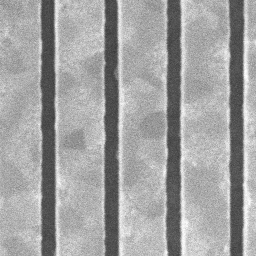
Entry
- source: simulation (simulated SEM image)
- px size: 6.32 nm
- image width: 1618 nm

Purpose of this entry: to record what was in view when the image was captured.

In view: lines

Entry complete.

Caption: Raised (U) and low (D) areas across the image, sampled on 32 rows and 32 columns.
UUUUUDDUUUUUUDDUUUUUUDDUUUUUUDDU
UUUUUDDUUUUUUDDUUUUUUDDUUUUUUDDU
UUUUUDDUUUUUUDDUUUUUUDDUUUUUUDDU
UUUUUDDUUUUUUDDUUUUUUDDUUUUUUDDU
UUUUUDDUUUUUUDDUUUUUUDDUUUUUUDDU
UUUUUDDUUUUUUDDUUUUUUDDUUUUUUDDU
UUUUUDDUUUUUUDDUUUUUUDDUUUUUUDDU
UUUUUDDUUUUUUDDUUUUUUDDUUUUUUDDU
UUUUUDDUUUUUUDDUUUUUUDDUUUUUUDDU
UUUUUDDUUUUUUDDUUUUUUDDUUUUUUDDU
UUUUUDDUUUUUUDDUUUUUUDDUUUUUUDDU
UUUUUDDUUUUUUDDUUUUUUDDUUUUUUDDU
UUUUUDDUUUUUUDDUUUUUUDDUUUUUUDDU
UUUUUDDUUUUUUDDUUUUUUDDUUUUUUDDU
UUUUUDDUUUUUUDDUUUUUUDDUUUUUUDDU
UUUUUDDUUUUUUDDUUUUUUDDUUUUUUDDU
UUUUUDDUUUUUUDDUUUUUUDDUUUUUUDDU
UUUUUDDUUUUUUDDUUUUUUDDUUUUUUDDU
UUUUUDDUUUUUUDDUUUUUUDDUUUUUUDDU
UUUUUDDUUUUUUDDUUUUUUDDUUUUUUDDU
UUUUUDDUUUUUUDDUUUUUUDDUUUUUUDDU
UUUUUDDUUUUUUDDUUUUUUDDUUUUUUDDU
UUUUUDDUUUUUUDDUUUUUUDDUUUUUUDDU
UUUUUDDUUUUUUDDUUUUUUDDUUUUUUDDU
UUUUUDDUUUUUUDDUUUUUUDDUUUUUUDDU
UUUUUDDUUUUUUDDUUUUUUDDUUUUUUDDU
UUUUUDDUUUUUUDDUUUUUUDDUUUUUUDDU
UUUUUDDUUUUUUDDUUUUUUDDUUUUUUDDU
UUUUUDDUUUUUUDDUUUUUUDDUUUUUUDUU
UUUUUDDUUUUUUDDUUUUUUDDUUUUUUDUU
UUUUUDDUUUUUUDDUUUUUUDDUUUUUUDUU
UUUUUDDUUUUUUDDUUUUUUDDUUUUUUDUU